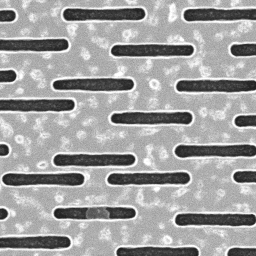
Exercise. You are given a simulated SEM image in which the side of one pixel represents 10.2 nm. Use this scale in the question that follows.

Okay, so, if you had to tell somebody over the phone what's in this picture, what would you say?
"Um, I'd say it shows a regular array of holes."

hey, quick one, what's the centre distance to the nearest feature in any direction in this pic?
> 614 nanometres